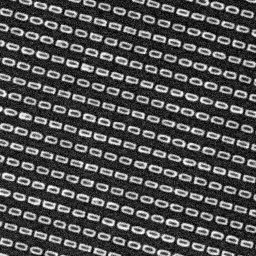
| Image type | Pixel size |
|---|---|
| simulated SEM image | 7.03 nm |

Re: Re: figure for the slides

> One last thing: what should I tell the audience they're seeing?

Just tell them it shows a regular array of raised bodies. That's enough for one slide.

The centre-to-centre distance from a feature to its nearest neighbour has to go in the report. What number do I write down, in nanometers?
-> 108